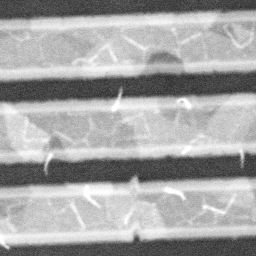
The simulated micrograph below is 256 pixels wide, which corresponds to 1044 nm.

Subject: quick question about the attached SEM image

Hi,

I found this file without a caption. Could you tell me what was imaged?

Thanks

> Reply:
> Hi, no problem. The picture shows one or a few lines or trenches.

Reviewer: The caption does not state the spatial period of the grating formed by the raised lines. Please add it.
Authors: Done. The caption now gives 339 nm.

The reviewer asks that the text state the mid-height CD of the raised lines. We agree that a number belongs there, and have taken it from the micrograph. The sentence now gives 0.2 microns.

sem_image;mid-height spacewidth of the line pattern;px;34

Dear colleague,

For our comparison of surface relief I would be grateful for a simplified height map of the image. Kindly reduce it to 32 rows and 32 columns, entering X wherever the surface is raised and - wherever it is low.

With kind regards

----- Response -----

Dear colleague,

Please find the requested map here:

--------------------------------
--------------------------------
----------------XXXXXXXXXXXXXXXX
XXXXXXXXXXXXXXXXXXXXXXXXXXXXXXXX
XXXXXXXXXXXXXXXXXXXXXXXXXXXXXXXX
XXXXXXXXXXXXXXXXXXXXXXXXXXXXXXXX
XXXXXXXXXXXXXXXXXXXXXXXXXXXXXXXX
XXXXXXXXXXXXXXXXXXXXXXXXXXXXXXXX
XXXXXXXXXXXXXXXXXXXXXXXX--------
--------------------------------
--------------------------------
--------------------------------
---------------------------XX-XX
XX-XXXXXXXXXXXXXXXXXXXXXXXXXXXXX
XXXXXXXXXXXXXXXXXXXXXXXXXXXXXXXX
XXXXXXXXXXXXXXXXXXXXXXXXXXXXXXXX
XXXXXXXXXXXXXXXXXXXXXXXXXXXXXXXX
XXXXXXXXXXXXXXXXXXXXXXXXXXXXXXXX
XXXXXXXXXXXXXXXXXXXXXXXXXXXXXXXX
XXXXXXX-------------------------
--------------------------------
--------------------------------
--------------------------------
----------------XXXXXXXXXXXXXXXX
XXXXXXXXXXXXXXXXXXXXXXXXXXXXXXXX
XXXXXXXXXXXXXXXXXXXXXXXXXXXXXXXX
XXXXXXXXXXXXXXXXXXXXXXXXXXXXXXXX
XXXXXXXXXXXXXXXXXXXXXXXXXXXXXXXX
XXXXXXXXXXXXXXXXXXXXXXXXXXXXXXXX
XXXXXXXXXXXXXX------------------
--------------------------------
--------------------------------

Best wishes